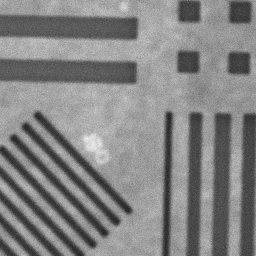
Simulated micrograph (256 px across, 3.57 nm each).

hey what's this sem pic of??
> groups of lines, slits or small figures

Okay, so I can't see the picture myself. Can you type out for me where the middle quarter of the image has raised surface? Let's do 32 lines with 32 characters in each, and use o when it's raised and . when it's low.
...................ooooooooo....
...................ooooooooo....
...................ooooooooooooo
..................oooooooooooooo
..................oooooooooooooo
oooooooooooooooooooooooooooooooo
oooooooooooooooooooooooooooooooo
oooooooooooooooooooooooooooooooo
oooooooooooooooooooooooooooooooo
oooooooooooooooooooooooooooooooo
oooooooooooooooooooooooooooooooo
oooooooooooooooooooooooooooooooo
ooooooooooooooooooooooooo..oooo.
ooooooooooooooooooooooooo..oooo.
ooooooooooooooooooooooooo..oooo.
ooooooooooooooooooooooooo..oooo.
ooooooooooooooooooooooooo..oooo.
ooooooooooooooooooooooooo..oooo.
ooooooooooooooooooooooooo..oooo.
.oooooooooooooooooooooooo..oooo.
..ooooooooooooooooooooooo..oooo.
...oooooooooooooooooooooo..oooo.
o...ooooooooooooooooooooo..oooo.
oo...oooooooooooooooooooo..oooo.
ooo...ooooooooooooooooooo..oooo.
.ooo...oooooooooooooooooo..oooo.
..ooo...ooooooooooooooooo..oooo.
...ooo...oooooooooooooooo..oooo.
o...ooo...ooooooooooooooo..oooo.
oo...ooo...oooooooooooooo..oooo.
ooo...ooo...ooooooooooooo..oooo.
.ooo...ooo...oooooooooooo..oooo.